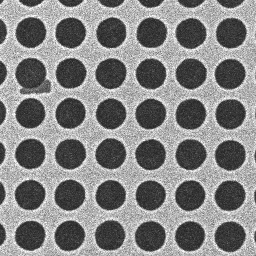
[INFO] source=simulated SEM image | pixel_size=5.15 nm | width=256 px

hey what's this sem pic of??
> a regular array of holes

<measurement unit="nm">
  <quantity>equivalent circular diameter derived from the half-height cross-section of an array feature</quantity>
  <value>158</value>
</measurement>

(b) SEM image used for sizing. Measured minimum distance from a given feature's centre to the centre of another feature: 205 nanometers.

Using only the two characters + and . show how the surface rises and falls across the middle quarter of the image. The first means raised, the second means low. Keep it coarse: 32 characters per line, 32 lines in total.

.....+++.......+++.......+++....
.....+++........++.......+++....
......++........++........++....
.....+++.......+++.......+++....
.....+++.......+++.......++++...
....+++++.....+++++.....+++++...
++++++++++++++++++++++++++++++++
++++++++++++++++++++++++++++++++
+.+++++++++.++++++++++++++++++++
....+++++.....+++++.....++++++..
.....+++.......+++.......++++...
.....+++.......+++.......+++....
.....+++........++........++....
.....+++.......+++.......+++....
.....++++......+++.......+++....
....+++++.....+++++.....+++++...
+++++++++++.++++++++++++++++++++
++++++++++++++++++++++++++++++++
+++++++++++.++++++++++++++++++++
....+++++.....++++++....+++++...
.....++++......++++......++++...
.....+++.......+++.......+++....
......++........++........++....
.....+++.......+++.......+++....
.....+++.......+++.......+++....
....+++++.....+++++.....+++++...
+++++++++++++++++++++.+++++++++.
++++++++++++++++++++++++++++++++
++++++++++++++++++++++++++++++++
....++++++....++++++...+++++++..
.....++++......+++.......++++...
.....+++.......+++.......+++....